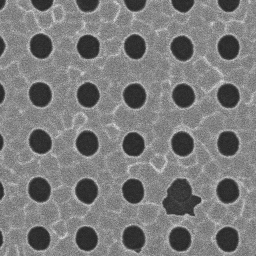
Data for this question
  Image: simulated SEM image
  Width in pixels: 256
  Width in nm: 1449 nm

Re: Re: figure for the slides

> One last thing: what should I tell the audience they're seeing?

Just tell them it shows a regular array of holes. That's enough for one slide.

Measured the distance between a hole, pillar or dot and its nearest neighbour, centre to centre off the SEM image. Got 46.6 pixels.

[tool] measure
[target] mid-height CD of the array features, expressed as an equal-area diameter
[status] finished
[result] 131 nm